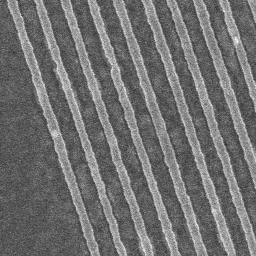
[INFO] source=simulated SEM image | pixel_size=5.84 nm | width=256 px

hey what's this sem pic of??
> parallel lines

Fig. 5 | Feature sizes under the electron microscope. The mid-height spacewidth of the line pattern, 98.3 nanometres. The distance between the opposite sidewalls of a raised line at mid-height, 52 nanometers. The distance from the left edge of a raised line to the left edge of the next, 148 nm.